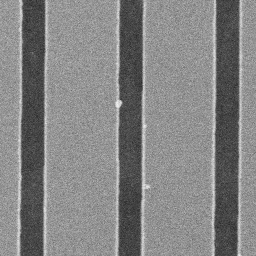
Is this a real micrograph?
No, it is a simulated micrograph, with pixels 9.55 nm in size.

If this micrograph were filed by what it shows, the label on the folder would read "lines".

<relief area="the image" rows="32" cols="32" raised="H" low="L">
HHHLLLHHHHHHHHHLLLHHHHHHHHHLLLHH
HHHLLLHHHHHHHHHLLLHHHHHHHHHLLLHH
HHHLLLHHHHHHHHHLLLHHHHHHHHHLLLHH
HHHLLLHHHHHHHHHLLLHHHHHHHHHLLLHH
HHHLLLHHHHHHHHHLLLHHHHHHHHHLLLHH
HHHLLLHHHHHHHHHLLLHHHHHHHHHLLLHH
HHHLLLHHHHHHHHHLLLHHHHHHHHHLLLHH
HHHLLLHHHHHHHHHLLLHHHHHHHHHLLLHH
HHHLLLHHHHHHHHHLLLHHHHHHHHHLLLHH
HHHLLLHHHHHHHHHLLLHHHHHHHHHLLLHH
HHHLLLHHHHHHHHHLLLHHHHHHHHHLLLHH
HHHLLLHHHHHHHHHLLLHHHHHHHHHLLLHH
HHHLLLHHHHHHHHHLLLHHHHHHHHHLLLHH
HHHLLLHHHHHHHHHLLLHHHHHHHHHLLLHH
HHHLLLHHHHHHHHHLLLHHHHHHHHHLLLHH
HHHLLLHHHHHHHHHLLLHHHHHHHHHLLLHH
HHHLLLHHHHHHHHHLLLHHHHHHHHHLLLHH
HHHLLLHHHHHHHHHLLLHHHHHHHHHLLLHH
HHHLLLHHHHHHHHHLLLHHHHHHHHHLLLHH
HHHLLLHHHHHHHHHLLLHHHHHHHHHLLLHH
HHHLLLHHHHHHHHHLLLHHHHHHHHHLLLHH
HHHLLLHHHHHHHHHLLLHHHHHHHHHLLLHH
HHHLLLHHHHHHHHHLLLHHHHHHHHHLLLHH
HHHLLLHHHHHHHHHLLLHHHHHHHHHLLLHH
HHHLLLHHHHHHHHHLLLHHHHHHHHHLLLHH
HHHLLLHHHHHHHHHLLLHHHHHHHHHLLLHH
HHLLLLHHHHHHHHHLLLHHHHHHHHHLLLHH
HHLLLLHHHHHHHHHLLLHHHHHHHHHLLLHH
HHLLLLHHHHHHHHHLLLHHHHHHHHHLLLHH
HHLLLLHHHHHHHHHLLLHHHHHHHHHLLLHH
HHLLLLHHHHHHHHHLLLHHHHHHHHHLLLHH
HHLLLLHHHHHHHHHLLLHHHHHHHHHLLLHH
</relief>